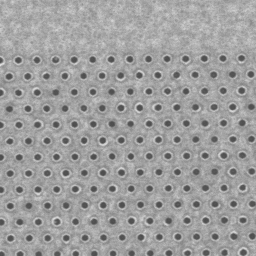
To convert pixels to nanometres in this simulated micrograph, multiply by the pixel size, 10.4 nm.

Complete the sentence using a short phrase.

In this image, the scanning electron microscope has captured a regular array of holes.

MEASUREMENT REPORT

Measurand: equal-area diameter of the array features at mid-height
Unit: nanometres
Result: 73.5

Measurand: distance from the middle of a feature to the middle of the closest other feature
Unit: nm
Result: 191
